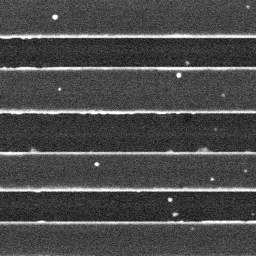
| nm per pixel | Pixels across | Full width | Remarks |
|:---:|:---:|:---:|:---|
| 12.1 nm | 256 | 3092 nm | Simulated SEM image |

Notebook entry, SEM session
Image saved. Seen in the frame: lines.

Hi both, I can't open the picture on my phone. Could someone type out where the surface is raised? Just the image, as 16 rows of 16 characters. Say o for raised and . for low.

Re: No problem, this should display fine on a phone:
oooooooooooooooo
oooooooooooooooo
................
................
oooooooooooooooo
oooooooooooooooo
oooooooooooooooo
................
................
................
oooooooooooooooo
oooooooooooooooo
................
................
oooooooooooooooo
oooooooooooooooo